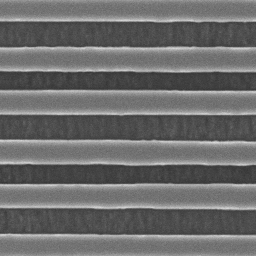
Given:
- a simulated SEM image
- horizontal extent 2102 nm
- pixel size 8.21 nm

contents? lines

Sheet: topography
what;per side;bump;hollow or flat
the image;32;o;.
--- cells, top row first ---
oooooooooooooooooooooooooooooooo
oooooooooooooooooooooooooooooooo
oooooooooooooooooooooooooooooooo
................................
................................
................................
oooooooooooooooooooooooooooooooo
oooooooooooooooooooooooooooooooo
oooooooooooooooooooooooooooooooo
................................
................................
oooooooooooooooooooooooooooooooo
oooooooooooooooooooooooooooooooo
oooooooooooooooooooooooooooooooo
................................
................................
................................
................................
oooooooooooooooooooooooooooooooo
oooooooooooooooooooooooooooooooo
.......oo.o..ooooooooooooooooooo
................................
................................
oooooooooooooooooooooooooooooooo
oooooooooooooooooooooooooooooooo
oooooooooooooooooooooooooooooooo
................................
................................
................................
oooooooooooooooooooooooo.ooooo.o
oooooooooooooooooooooooooooooooo
oooooooooooooooooooooooooooooooo